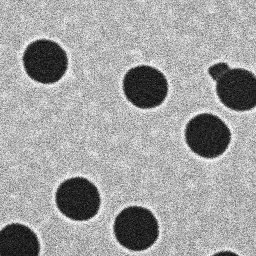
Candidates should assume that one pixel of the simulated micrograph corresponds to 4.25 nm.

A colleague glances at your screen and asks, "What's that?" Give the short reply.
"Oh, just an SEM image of holes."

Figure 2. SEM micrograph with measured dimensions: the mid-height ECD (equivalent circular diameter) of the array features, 193 nanometers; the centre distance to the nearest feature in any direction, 79.2 px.